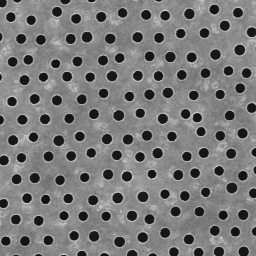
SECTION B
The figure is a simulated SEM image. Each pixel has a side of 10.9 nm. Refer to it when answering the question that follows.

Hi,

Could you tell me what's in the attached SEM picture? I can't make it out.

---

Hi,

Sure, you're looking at a regular array of holes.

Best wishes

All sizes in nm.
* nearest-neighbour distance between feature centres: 211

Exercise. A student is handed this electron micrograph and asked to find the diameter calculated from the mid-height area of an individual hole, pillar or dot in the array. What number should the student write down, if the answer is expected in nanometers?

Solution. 106